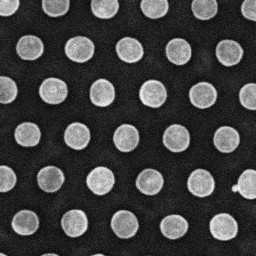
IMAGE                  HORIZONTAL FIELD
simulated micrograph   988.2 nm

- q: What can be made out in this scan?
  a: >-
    a regular array of raised bodies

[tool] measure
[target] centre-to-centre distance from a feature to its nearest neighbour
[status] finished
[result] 190 nanometers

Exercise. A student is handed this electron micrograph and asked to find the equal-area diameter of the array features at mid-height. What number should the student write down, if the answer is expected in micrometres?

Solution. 0.0982